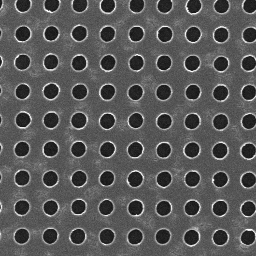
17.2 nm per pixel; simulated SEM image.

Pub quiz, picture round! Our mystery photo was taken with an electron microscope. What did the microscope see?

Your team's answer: a regular array of holes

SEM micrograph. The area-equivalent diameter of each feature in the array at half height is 0.257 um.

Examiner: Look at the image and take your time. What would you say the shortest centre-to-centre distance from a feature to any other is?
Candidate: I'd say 484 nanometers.